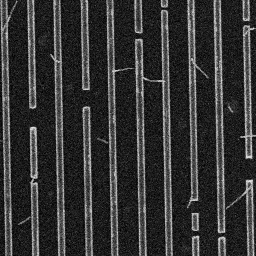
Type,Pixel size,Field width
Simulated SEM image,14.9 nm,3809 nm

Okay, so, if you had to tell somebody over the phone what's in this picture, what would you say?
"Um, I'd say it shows parallel lines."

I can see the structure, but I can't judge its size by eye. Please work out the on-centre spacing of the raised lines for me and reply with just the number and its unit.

400 nanometres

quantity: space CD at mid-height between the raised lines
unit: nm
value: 303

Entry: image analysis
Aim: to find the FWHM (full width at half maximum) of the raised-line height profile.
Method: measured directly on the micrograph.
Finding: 89.2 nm